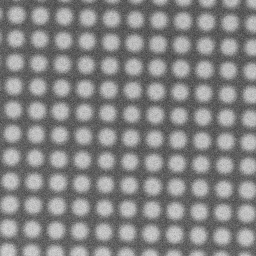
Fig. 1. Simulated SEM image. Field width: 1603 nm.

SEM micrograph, an array of small figures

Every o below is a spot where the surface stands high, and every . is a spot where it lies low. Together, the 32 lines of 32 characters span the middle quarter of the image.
oo..ooo...ooo..oooo..oooo..oooo.
o...ooo...ooo...ooo..oooo..oooo.
................oo....ooo...ooo.
................................
o...oo.....o....................
o..oooo..oooo...ooo...ooo...oo..
o..oooo..oooo..oooo..oooo..oooo.
o...ooo..oooo..oooo..oooo..oooo.
......................oo....oo..
................................
o...oo....oo....................
o..oooo..oooo..oooo..ooo....oo..
o..oooo..oooo..oooo..oooo..oooo.
....oo...oooo..oooo..oooo..oooo.
......................oo....oo..
................................
....oo....oo....................
o..oooo..oooo..ooo...ooo...ooo..
o..oooo..oooo..oooo..oooo..ooo..
....oo...ooo...ooo...ooo...ooo..
......................o....ooo..
................................
...ooo....o.....................
o..ooo...ooo...ooo...ooo...ooo..
o..oooo..ooo...ooo..oooo..oooo..
...ooo...ooo...ooo...ooo..oooo..
......................o....ooo..
................................
...ooo...oo.....o...............
..oooo...ooo..oooo..oooo...ooo..
...ooo...ooo..oooo..oooo..oooo..
...ooo...ooo...ooo..oooo..oooo..